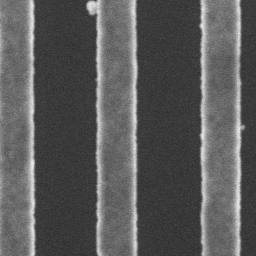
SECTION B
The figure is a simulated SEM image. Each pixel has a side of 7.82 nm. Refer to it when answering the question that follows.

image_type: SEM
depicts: lines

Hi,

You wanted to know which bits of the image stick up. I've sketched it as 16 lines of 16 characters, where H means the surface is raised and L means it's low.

HHLLLLHHLLLLLHHL
HHLLLLHHLLLLLHHL
HHLLLLHHLLLLLHHL
HHLLLLHHLLLLLHHL
HHLLLLHHHLLLLHHL
HHLLLLHHLLLLLHHL
HHLLLLHHLLLLLHHL
HHLLLLHHLLLLLHHL
HHLLLLHHLLLLLHHL
HHLLLLHHLLLLLHHL
HHLLLLHHLLLLLHHL
HHLLLLHHLLLLLHHL
HHLLLLHHLLLLLHHL
HHLLLLHHLLLLLHHL
HHLLLLHHHLLLLHHL
HHLLLLHHHLLLLHHL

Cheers